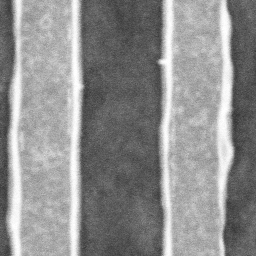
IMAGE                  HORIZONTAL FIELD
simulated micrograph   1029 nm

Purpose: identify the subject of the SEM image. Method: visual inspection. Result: one or a few lines or trenches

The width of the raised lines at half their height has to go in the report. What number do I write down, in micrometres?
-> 0.23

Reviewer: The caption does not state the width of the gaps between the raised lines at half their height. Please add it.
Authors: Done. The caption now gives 93.6 px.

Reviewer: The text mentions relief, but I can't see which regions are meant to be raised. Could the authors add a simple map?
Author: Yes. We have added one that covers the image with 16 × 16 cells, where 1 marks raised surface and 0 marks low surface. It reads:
0111100000011100
0111100000011100
0111100000011100
0111100000011100
0111100000011100
0111100000111100
0111100000111100
0111100000111100
0111100000111100
0111100000111100
0111100000111100
0111100000111100
0111100000011100
0111100000011100
0111100000111100
0111100000011100